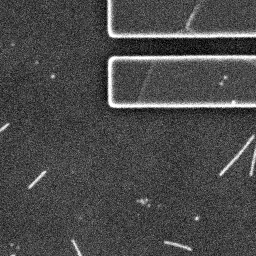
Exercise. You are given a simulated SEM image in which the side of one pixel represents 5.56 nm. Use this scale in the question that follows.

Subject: wiring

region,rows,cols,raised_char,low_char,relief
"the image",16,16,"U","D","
DDDDDDDUUUUUUUUU
DDDDDDDUUUUUUUUU
DDDDDDDDDDDDDDDD
DDDDDDDDDDDDDDDD
DDDDDDDUUUUUUUUU
DDDDDDDUUUUUUUUU
DDDDDDDUUUUUUUUU
DDDDDDDDDDDDDDDD
DDDDDDDDDDDDDDDD
DDDDDDDDDDDDDDDD
DDDDDDDDDDDDDDDD
DDDDDDDDDDDDDDDD
DDDDDDDDDDDDDDDD
DDDDDDDDDDDDDDDD
DDDDDDDDDDDDDDDD
DDDDDDDDDDDDDDDD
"